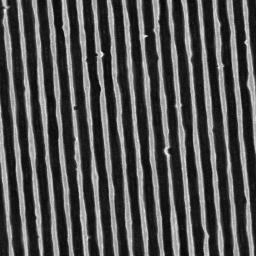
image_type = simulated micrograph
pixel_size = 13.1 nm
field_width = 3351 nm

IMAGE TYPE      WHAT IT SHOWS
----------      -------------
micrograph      parallel lines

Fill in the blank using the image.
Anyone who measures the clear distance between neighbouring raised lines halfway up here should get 116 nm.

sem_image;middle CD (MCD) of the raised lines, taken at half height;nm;76.6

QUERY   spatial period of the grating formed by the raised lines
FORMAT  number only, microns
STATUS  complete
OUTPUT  0.196